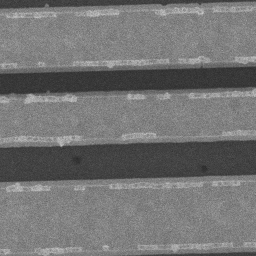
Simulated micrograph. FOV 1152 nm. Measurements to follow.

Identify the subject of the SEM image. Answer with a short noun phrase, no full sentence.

one or a few lines or trenches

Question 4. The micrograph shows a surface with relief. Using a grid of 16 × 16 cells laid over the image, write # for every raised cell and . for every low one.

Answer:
...........#####
################
################
################
................
................
################
################
################
................
................
....#.##########
################
################
################
################